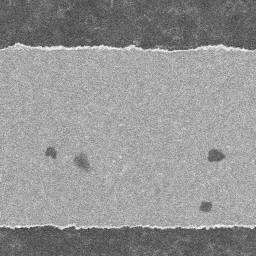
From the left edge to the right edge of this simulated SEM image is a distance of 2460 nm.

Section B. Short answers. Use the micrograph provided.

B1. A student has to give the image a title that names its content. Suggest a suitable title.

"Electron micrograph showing one or a few lines or trenches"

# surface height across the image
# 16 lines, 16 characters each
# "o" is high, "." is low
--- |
................
................
................
oooooooooooooooo
oooooooooooooooo
oooooooooooooooo
oooooooooooooooo
oooooooooooooooo
oooooooooooooooo
oooooooooooooooo
oooooooooooooooo
oooooooooooooooo
oooooooooooooooo
oooooooooooooooo
................
................